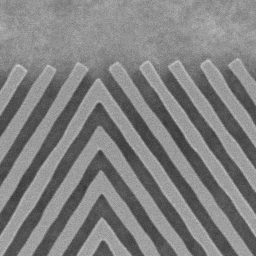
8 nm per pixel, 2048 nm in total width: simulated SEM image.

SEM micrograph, groups of lines, slits or small figures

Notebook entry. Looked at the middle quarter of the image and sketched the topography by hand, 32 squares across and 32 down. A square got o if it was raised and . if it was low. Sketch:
...oo.......oo.....ooo....oooo..
..oooo......ooo....oooo....ooo..
..ooo.......oooo....ooo....oooo.
.oooo.......oooo.....ooo....ooo.
oooo....o....oooo....oooo....ooo
ooo....ooo....oooo....ooo....ooo
ooo...ooooo....ooo.....ooo....oo
oo....ooooo....oooo.....ooo....o
oo...ooooooo....oooo....oooo...o
o....oooooooo....ooo.....ooo....
....oooo..ooo....oooo....oooo...
....ooo....ooo....oooo....oooo..
...ooo.....oooo....oooo....ooo..
..oooo......oooo....oooo...oooo.
..ooo........ooo....oooo....oooo
.oooo........oooo....oooo....ooo
.ooo....oo....oooo....oooo...ooo
ooo....oooo....ooo....oooo....oo
ooo....ooooo...oooo....oooo...oo
oo....oooooo....oooo....oooo...o
o.....ooooooo....ooo.....ooo....
o....ooooooooo...oooo....oooo...
....oooo..oooo....oooo....ooo...
....ooo....oooo....oooo....ooo..
...oooo.....oooo....oooo...oooo.
..oooo......oooo....oooo....oooo
..ooo........oooo....oooo...oooo
.oooo....o....oooo....oooo...ooo
oooo....ooo....ooo.....ooo....oo
oooo...ooooo...oooo....oooo....o
ooo...oooooo....oooo....oooo....
oo....ooooooo....oooo....ooo....